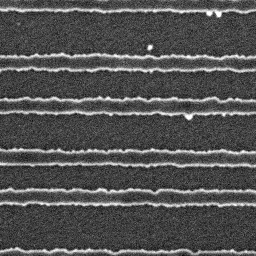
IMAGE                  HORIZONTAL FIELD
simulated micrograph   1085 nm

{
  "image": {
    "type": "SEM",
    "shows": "lines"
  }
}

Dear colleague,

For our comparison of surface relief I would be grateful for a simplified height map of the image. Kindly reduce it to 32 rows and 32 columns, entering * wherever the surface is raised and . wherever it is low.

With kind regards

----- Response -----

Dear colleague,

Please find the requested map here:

********************************
.............*........*...**..*.
................................
................................
................................
................................
................................
********************************
********************************
................................
................................
................................
*********.**********************
********************************
.......................*........
................................
................................
................................
................................
********************************
********************************
................................
................................
................................
********************************
****.***************************
................................
................................
................................
................................
................................
**************.*********.*******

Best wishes